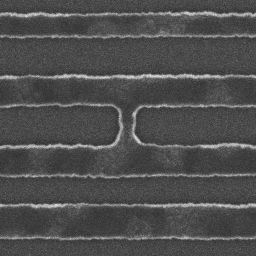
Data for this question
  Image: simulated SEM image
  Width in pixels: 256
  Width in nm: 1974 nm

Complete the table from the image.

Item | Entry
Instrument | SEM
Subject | one or a few lines or trenches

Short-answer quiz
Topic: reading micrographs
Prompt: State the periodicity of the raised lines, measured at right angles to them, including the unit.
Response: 0.505 micrometres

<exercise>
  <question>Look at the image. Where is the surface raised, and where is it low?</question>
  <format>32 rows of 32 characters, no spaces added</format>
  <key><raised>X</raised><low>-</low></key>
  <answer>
--------------------------------
-------------------------X------
XXXXXXXXXXXXXXXXXXXXXXXXXXXXXXXX
XXXXXXXXXXXXXXXXXXXXXXXXXXXXXXXX
XXXXXXXXXXXXXXXXXXXXXXXXXXXXX-XX
--------------------------------
--------------------------------
--------------------------------
--------------------------------
-------XXXX---XXXXXXXXXXXXXXXXXX
XXXXXXXXXXXXXXXXXXXXXXXXXXXXXXXX
XXXXXXXXXXXXXXXXXXXXXXXXXX-XXXXX
XXXXXXXXXXXXXXXXXXXXXXXXXXXXXXXX
---------------XXX--------------
---------------XX---------------
---------------XX---------------
---------------XX---------------
---------------XX---------------
XXXXXXXXXXXXXXXXXXXXXXXXXXXXXXXX
XXXXXXXXXXXXXXXXXXXXXXXXXXXXXXXX
XXXXXXXXXXXXXXXXXXXXXXXXXXXXXXXX
XXXXXXXXXXXXXXXXXXXXXXXXXXXXXXXX
--------------------------------
--------------------------------
--------------------------------
----------X---------------------
XXXXXXXXXXXXXXXXXXXXXXXXXXXXXXXX
XXXXXXXXXXXXXXXXXXXXXXX-XXXXXXXX
XXXXXXXXXXXXXXXXXXXXXXXX-XXXXXXX
XXXXXXXXXXXXXXXXXXXXXXXXXXXXXXXX
--------------------------------
--------------------------------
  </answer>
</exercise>